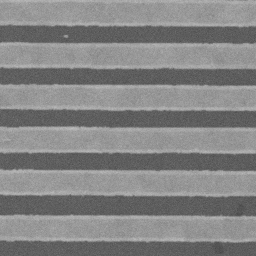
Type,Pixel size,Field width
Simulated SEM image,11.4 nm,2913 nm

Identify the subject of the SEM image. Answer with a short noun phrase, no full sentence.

lines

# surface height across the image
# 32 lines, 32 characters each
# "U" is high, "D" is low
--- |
UUUUUUUUUUUUUUUUUUUUUUUUUUUUUUUU
UUUUUUUUUUUUUUUUUUUUUUUUUUUUUUUU
UUUUUUUUUUUUUUUUUUUUUUUUUUUUUUUU
DDDDDDDDDDDDDDDDDDDDDDDDDDDDDDDD
DDDDDDDDDDDDDDDDDDDDDDDDDDDDDDDD
DDUDDDDDDDDDDDDDDDDDDDDDDDDDDDDD
UUUUUUUUUUUUUUUUUUUUUUUUUUUUUUUU
UUUUUUUUUUUUUUUUUUUUUUUUUUUUUUUU
DDDDDDDDDDDDDDDDDDDDDDDDDDDDDDDD
DDDDDDDDDDDDDDDDDDDDDDDDDDDDDDDD
DDDDDDDDDDDDDDDDDDDDDDDDDDDDDDDD
UUUUUUUUUUUUUUUUUUUUUUUUUUUUUUUU
UUUUUUUUUUUUUUUUUUUUUUUUUUUUUUUU
DDDDDDDDDUDDUUUUUUUUUUUUUUUUUUUU
DDDDDDDDDDDDDDDDDDDDDDDDDDDDDDDD
DDDDDDDDDDDDDDDDDDDDDDDDDDDDDDDD
UUUUUUUUUUUUUUUUUUUUUUUUUUUUUUUU
UUUUUUUUUUUUUUUUUUUUUUUUUUUUUUUU
UUUUUUUUUUUUUUUUUUUUUUUUUUUUUUUU
DDDDDDDDDDDDDDDDDDDDDDDDDDDDDDDD
DDDDDDDDDDDDDDDDDDDDDDDDDDDDDDDD
UUUUUUUUUUUUDDDDDDDDDDDDDDDDDDDD
UUUUUUUUUUUUUUUUUUUUUUUUUUUUUUUU
UUUUUUUUUUUUUUUUUUUUUUUUUUUUUUUU
DDDDDDDDDDDDDDDDDDDDDDDDDDDDDDDD
DDDDDDDDDDDDDDDDDDDDDDDDDDDDDDDD
DDDDDDDDDDDDDDDDDDDDDDDDDDDDDDDD
UUUUUUUUUUUUUUUUUUUUUUUUUUUUUUUU
UUUUUUUUUUUUUUUUUUUUUUUUUUUUUUUU
UUUUUUUUUUUUUUUUUUUUUUUUUUUUUUUU
DDDDDDDDDDDDDDDDDDDDDDDDDDDDDDDD
DDDDDDDDDDDDDDDDDDDDDDDDDDDDDDDD